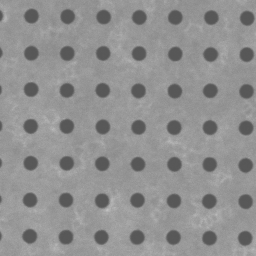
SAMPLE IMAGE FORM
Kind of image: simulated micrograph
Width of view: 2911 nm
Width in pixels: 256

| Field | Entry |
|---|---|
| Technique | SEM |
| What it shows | a regular array of holes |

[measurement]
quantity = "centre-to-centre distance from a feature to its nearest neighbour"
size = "405 nm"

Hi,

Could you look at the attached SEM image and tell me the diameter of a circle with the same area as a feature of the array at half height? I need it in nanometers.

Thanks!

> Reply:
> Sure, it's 169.